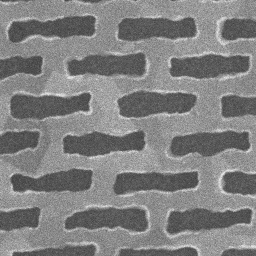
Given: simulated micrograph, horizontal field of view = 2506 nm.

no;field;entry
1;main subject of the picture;a regular array of holes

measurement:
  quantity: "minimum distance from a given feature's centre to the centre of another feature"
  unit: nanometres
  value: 609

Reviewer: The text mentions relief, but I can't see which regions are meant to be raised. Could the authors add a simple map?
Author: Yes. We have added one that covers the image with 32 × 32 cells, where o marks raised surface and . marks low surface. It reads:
oooooooooooooooooooooooooooooooo
oooooooooooooooooooooooooooooooo
ooooooo.....ooo.........oooo....
o...........ooo..........oo.....
o...o.....ooooo.........oooo....
oooooooooooooooooooooooooooooooo
oooooooooooooooooooooooooooooooo
.....oooo.........ooo..........o
.....ooo..........ooo..........o
.oooooooooooo..o..oooo......oooo
oooooooooooooooooooooooooooooooo
ooooooooooooooooo..ooooooooooooo
o..........oooo..........ooo....
o..........oooo.........oooo....
o.......ooooooo....ooooooooo..oo
oooooooooooooooooooooooooooooooo
o....oooooooooooo.ooooooo.oo...o
.....ooo..........oooo.........o
....oooo..........ooo..........o
ooooooooooo.ooooooooo..oo..ooooo
oooooooooooooooooooooooooooooooo
ooooooo....ooooo.oooooo..oooo.oo
o...........oo...........ooo....
oo.........ooo..........oooo....
oooooooooooooooooooooooooooooooo
oooooooooooooooooooooooooooooooo
.....ooooo........oooo.....o...o
.....ooo..........ooo..........o
...ooooo....ooo...ooo.......oooo
oooooooooooooooooooooooooooooooo
oooooooo.ooooooooooooooooooooooo
oo..........ooo..........ooo....